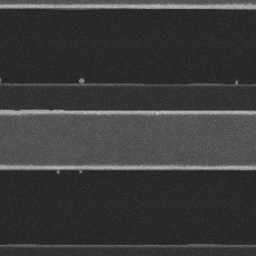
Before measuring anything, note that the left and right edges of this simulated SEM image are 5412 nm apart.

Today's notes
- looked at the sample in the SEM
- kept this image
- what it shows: lines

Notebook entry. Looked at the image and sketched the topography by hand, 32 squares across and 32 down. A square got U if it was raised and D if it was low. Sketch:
UUUUUUUUUUUUUUUUUUUUUUUUUUUUUUUU
DDDDDDDDDDDDDDDDDDDDDDDDDDDDDDDD
DDDDDDDDDDDDDDDDDDDDDDDDDDDDDDDD
DDDDDDDDDDDDDDDDDDDDDDDDDDDDDDDD
DDDDDDDDDDDDDDDDDDDDDDDDDDDDDDDD
DDDDDDDDDDDDDDDDDDDDDDDDDDDDDDDD
DDDDDDDDDDDDDDDDDDDDDDDDDDDDDDDD
DDDDDDDDDDDDDDDDDDDDDDDDDDDDDDDD
DDDDDDDDDDDDDDDDDDDDDDDDDDDDDDDD
DDDDDDDDDDDDDDDDDDDDDDDDDDDDDDDD
DDDDDDDDDDDDDDDDDDDDDDDDDDDDDDDD
UUUUUUUUUUUUUUUUUUUUUUUUUUUUUUUU
UUUUUUUUUUUUUUUUUUUUUUUUUUUUUUUU
UUUUUUUUUUUUUUUUUUUUUUUUUUUUUUUU
UUUUUUUUUUUUUUUUUUUUUUUUUUUUUUUU
UUUUUUUUUUUUUUUUUUUUUUUUUUUUUUUU
UUUUUUUUUUUUUUUUUUUUUUUUUUUUUUUU
UUUUUUUUUUUUUUUUUUUUUUUUUUUUUUUU
UUUUUUUUUUUUUUUUUUUUUUUUUUUUUUUU
UUUUUUUUUUUUUUUUUUUUUUUUUUUUUUUU
UUUUUUUUUUUUUUUUUUUUUUUUUUUUUUUU
DDDDDDDDDDDDDDDDDDDDDDDDDDDDDDDD
DDDDDDDDDDDDDDDDDDDDDDDDDDDDDDDD
DDDDDDDDDDDDDDDDDDDDDDDDDDDDDDDD
DDDDDDDDDDDDDDDDDDDDDDDDDDDDDDDD
DDDDDDDDDDDDDDDDDDDDDDDDDDDDDDDD
DDDDDDDDDDDDDDDDDDDDDDDDDDDDDDDD
DDDDDDDDDDDDDDDDDDDDDDDDDDDDDDDD
DDDDDDDDDDDDDDDDDDDDDDDDDDDDDDDD
DDDDDDDDDDDDDDDDDDDDDDDDDDDDDDDD
DDDDDDDDDDDDDDDDDDDDDDDDDDDDDDDD
UUUUUUUUUUUUUUUUUUUUUUUUUUUUUUUU